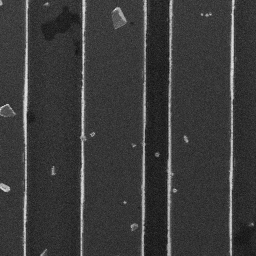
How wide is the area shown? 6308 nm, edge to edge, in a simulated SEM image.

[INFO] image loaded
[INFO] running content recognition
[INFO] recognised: lines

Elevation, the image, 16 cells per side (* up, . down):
**...****..****.
**...****..****.
**...****..****.
**...****..****.
**...****..****.
**...****..****.
**...****..****.
**...****..****.
**...****..****.
**...****..****.
**...****..***..
**...****..***..
**...****..***..
**...****..***..
**...****..***..
**...****..***..